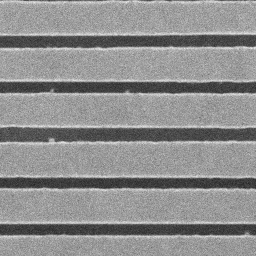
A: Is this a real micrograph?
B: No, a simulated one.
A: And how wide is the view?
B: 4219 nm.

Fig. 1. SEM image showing lines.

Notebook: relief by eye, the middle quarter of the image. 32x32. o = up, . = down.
oooooooooooooooooooooooooooooooo
oooooooooooooooooooooooooooooooo
oooooooooooooooooooooooooooooooo
oooooooooooooooooooooooooooooooo
............................ooo.
................................
................................
oooooooooooooooooooooooooooooooo
oooooooooooooooooooooooooooooooo
oooooooooooooooooooooooooooooooo
oooooooooooooooooooooooooooooooo
oooooooooooooooooooooooooooooooo
oooooooooooooooooooooooooooooooo
oooooooooooooooooooooooooooooooo
oooooooooooooooooooooooooooooooo
oooooooooooooooooooooooooooooooo
................................
................................
................................
..ooooo.oo.ooooo.ooooo..oo.ooooo
oooooooooooooooooooooooooooooooo
oooooooooooooooooooooooooooooooo
oooooooooooooooooooooooooooooooo
oooooooooooooooooooooooooooooooo
oooooooooooooooooooooooooooooooo
oooooooooooooooooooooooooooooooo
oooooooooooooooooooooooooooooooo
oooooooooooooooooooooooooooooooo
................................
................................
................................
oooooooooooooooooooooooooooooooo